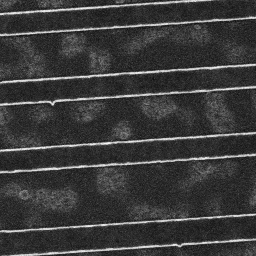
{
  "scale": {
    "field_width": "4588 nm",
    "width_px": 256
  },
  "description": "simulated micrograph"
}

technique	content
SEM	one or a few lines or trenches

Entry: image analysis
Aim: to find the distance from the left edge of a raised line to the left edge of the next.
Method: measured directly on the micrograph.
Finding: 1310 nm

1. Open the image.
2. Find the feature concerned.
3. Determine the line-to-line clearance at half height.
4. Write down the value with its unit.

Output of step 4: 0.825 µm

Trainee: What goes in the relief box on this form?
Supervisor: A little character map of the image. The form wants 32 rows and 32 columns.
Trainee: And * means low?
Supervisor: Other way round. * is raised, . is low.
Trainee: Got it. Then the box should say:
..................**************
...*****************************
****************************....
*************...................
................................
................................
................................
................................
.........................*.*****
...........*********************
********************************
************************........
**********......................
................................
................................
................................
................................
..................**************
....****************************
******************************..
****************................
*...............................
................................
................................
................................
................................
................................
.....................***********
.......*************************
********************************
************************........
**********......................